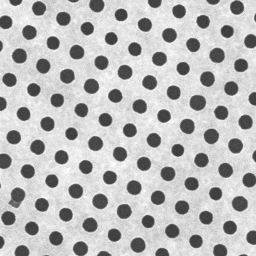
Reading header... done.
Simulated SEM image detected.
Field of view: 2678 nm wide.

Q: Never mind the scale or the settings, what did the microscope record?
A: a regular array of holes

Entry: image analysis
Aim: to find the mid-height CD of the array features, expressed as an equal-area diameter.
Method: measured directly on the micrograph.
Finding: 0.151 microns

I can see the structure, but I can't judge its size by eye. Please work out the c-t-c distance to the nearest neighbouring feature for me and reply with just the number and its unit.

268 nanometers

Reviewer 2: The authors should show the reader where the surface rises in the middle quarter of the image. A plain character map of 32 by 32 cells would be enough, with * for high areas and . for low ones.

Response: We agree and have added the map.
********...***..*******.****...*
..*******.***....***********...*
...**********....************..*
...***********...***...*********
..***...************...*********
*****....***********...****.****
*****....***..************...***
***********....***********...***
***********....***********...***
************..***...***********.
***...***********....**********.
***...***********....***..******
***...***..************....*****
*********...***********....*****
*********...************..***...
**********.****...***********...
*..************...***********...
...************...***..********.
*..****..************...********
******....***********...********
******....***********...***...**
*******..***...************...**
.***********....***********...**
.************...***..***********
.***...***********....**********
****...***********....**********
****...************..***....****
*****.****...***********....****
**********...***********...****.
**********...***...***********..
**..************...***********..
*....***********...************.